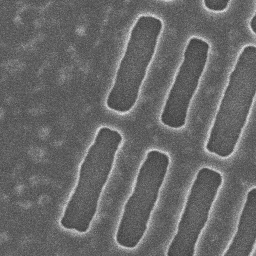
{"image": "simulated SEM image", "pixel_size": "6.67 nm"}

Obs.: holes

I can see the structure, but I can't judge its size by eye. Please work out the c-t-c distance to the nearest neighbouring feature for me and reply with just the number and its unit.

362 nanometres